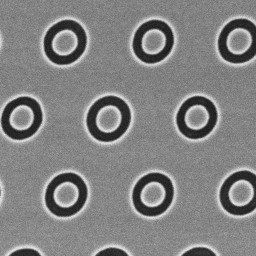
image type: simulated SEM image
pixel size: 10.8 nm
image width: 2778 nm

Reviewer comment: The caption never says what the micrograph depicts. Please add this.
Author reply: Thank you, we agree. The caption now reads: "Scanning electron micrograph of ring-shaped grooves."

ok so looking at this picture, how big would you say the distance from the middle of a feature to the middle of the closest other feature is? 943 nm